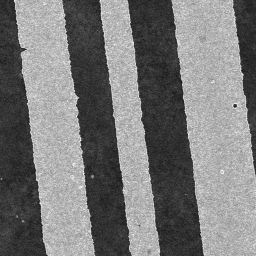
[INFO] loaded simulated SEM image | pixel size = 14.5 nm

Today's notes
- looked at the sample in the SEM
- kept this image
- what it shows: one or a few lines or trenches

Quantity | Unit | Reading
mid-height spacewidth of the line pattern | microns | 0.566